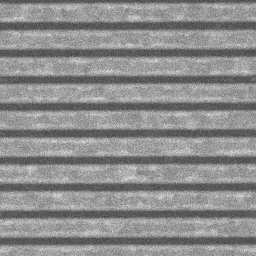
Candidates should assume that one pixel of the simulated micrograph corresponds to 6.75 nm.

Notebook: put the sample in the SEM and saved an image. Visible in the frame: parallel lines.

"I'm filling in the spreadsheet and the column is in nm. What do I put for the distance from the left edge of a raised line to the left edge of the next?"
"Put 182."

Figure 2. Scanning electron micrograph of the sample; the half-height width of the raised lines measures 111 nanometers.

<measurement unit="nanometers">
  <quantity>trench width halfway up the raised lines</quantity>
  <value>74.2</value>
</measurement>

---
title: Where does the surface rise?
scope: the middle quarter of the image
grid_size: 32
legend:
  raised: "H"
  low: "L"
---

HHHHHHHHHHHHHHHHHHHHHHHHHHHHHHHH
HHHHHHHHHHHHHHHHHHHHHHHHHHHHHHHH
HLLLLLLLLLLLLLLLLLLLLLLLLLLLLLLL
LLLLLLLLLLLLLLLLLLLLLLLLLLLLLLLL
LLLLLLLLLLLLLLLLLLLLLLLLLLLLLLLL
LLLLLLHHHHHHHHHHHHHHHHHHHHHHHHHH
HHHHHHHHHHHHHHHHHHHHHHHHHHHHHHHH
HHHHHHHHHHHHHHHHHHHHHHHHHHHHHHHH
HHHHHHHHHHHHHHHHHHHHHHHHHHHHHHHH
LLLLLLLLLLLLLLLLLLLLLLLLLLLLLLLL
LLLLLLLLLLLLLLLLLLLLLLLLLLLLLLLL
LLLLLLLLLLLLLLLLLLLLLLLLLLLLLLLL
HHHHHHHHHHHHHHHHHHHHHHHHHHHHHHHH
HHHHHHHHHHHHHHHHHHHHHHHHHHHHHHHH
HHHHHHHHHHHHHHHHHHHHHHHHHHHHHHHH
HHHHHHHHHHHHHHHHHHHHHHHHHHHHHHHH
LLLLLLLLLLLLLLLLLLLLLLLLLLLLLLLL
LLLLLLLLLLLLLLLLLLLLLLLLLLLLLLLL
LLLLLLLLLLLLLLLLLLLLLLLLLLLLLLLL
HHHHHHHHHHHHHHHHHHHHHHHHHHHHHHHH
HHHHHHHHHHHHHHHHHHHHHHHHHHHHHHHH
HHHHHHHHHHHHHHHHHHHHHHHHHHHHHHHH
HHHHHHHHHHHHHHHLLHHHHLLLLLLLLLLL
LLLLLLLLLLLLLLLLLLLLLLLLLLLLLLLL
LLLLLLLLLLLLLLLLLLLLLLLLLLLLLLLL
LLLLLLLLLLLLLLLLLLLLLLHLHLLHHHHH
HHHHHHHHHHHHHHHHHHHHHHHHHHHHHHHH
HHHHHHHHHHHHHHHHHHHHHHHHHHHHHHHH
HHHHHHHHHHHHHHHHHHHHHHHHHHHHHHHH
LLLLLLLLLLLLLLLLLLLLLLLLLLLLLLLL
LLLLLLLLLLLLLLLLLLLLLLLLLLLLLLLL
LLLLLLLLLLLLLLLLLLLLLLLLLLLLLLLL